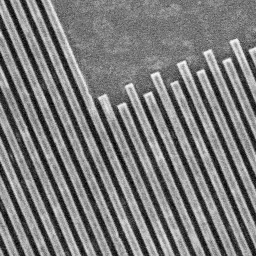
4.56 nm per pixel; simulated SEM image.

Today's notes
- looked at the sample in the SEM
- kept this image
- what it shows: parallel lines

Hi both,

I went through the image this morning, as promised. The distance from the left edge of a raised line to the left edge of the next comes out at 0.0653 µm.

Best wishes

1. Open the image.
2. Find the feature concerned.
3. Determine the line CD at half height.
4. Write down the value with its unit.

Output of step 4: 0.0357 µm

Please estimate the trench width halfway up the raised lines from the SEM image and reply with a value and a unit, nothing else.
26.7 nm